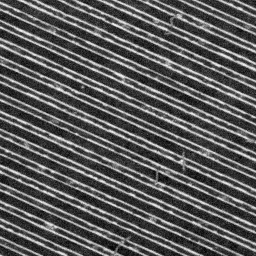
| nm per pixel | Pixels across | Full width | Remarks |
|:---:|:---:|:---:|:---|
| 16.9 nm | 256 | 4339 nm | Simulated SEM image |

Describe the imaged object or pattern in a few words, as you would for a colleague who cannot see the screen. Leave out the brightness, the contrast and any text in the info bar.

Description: parallel lines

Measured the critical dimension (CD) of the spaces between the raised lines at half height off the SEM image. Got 10.7 px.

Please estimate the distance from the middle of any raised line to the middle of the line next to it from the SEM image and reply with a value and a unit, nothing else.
279 nm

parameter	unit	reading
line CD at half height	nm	106